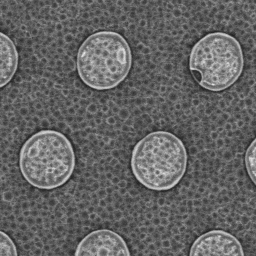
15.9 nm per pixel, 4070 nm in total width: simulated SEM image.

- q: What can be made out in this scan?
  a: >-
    raised bodies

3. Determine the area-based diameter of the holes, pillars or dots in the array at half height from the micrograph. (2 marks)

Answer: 886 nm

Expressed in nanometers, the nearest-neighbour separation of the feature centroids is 1800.